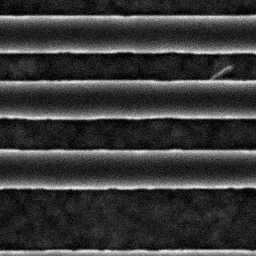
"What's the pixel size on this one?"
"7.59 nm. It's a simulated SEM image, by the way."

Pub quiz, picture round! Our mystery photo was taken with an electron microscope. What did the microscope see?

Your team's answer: lines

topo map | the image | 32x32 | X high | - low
--------------------------------
--------------------------------
XXXXXXXXXXXXXXXXXXXXXXXXXXXXXXXX
XXXXXXXXXXXXXXXXXXXXXXXXXXXXXXXX
XXXXXXXXXXXXXXXXXXXXXXXXXXXXXXXX
XXXXXXXXXXXXXXXXXXXXXXXXXXXXXXXX
XXXXXXXXXXXXXXX-XXXXX-XXXXXXXXXX
--------------------------------
--------------------------------
--------------------------------
XXXXXXXXXXXXXXXXXXXXXXXXXXXXXXXX
XXXXXXXXXXXXXXXXXXXXXXXXXXXXXXXX
XXXXXXXXXXXXXXXXXXXXXXXXXXXXXXXX
XXXXXXXXXXXXXXXXXXXXXXXXXXXXXXXX
XXXXXXXXXXXXXXXXXXXXXXXXXXXXXXXX
--------------------------------
--------------------------------
--------------------------------
--------------------------------
XXXXXXXXXXXXXXXXXXXXXXXXXXXXXXXX
XXXXXXXXXXXXXXXXXXXXXXXXXXXXXXXX
XXXXXXXXXXXXXXXXXXXXXXXXXXXXXXXX
XXXXXXXXXXXXXXXXXXXXXXXXXXXXXXXX
X----XXXXXXXXX-XX---------------
--------------------------------
--------------------------------
--------------------------------
--------------------------------
--------------------------------
--------------------------------
--------------------------------
XXXXXXXXXXXXXXXXXXXXXXXXXXXXXXXX